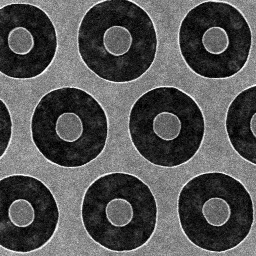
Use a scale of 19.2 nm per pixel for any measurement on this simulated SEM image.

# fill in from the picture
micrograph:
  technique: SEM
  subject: ring-shaped grooves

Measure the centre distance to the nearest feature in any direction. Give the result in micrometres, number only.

1.87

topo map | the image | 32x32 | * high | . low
**.*********.....********....***
......*****.......******......**
......****.........****........*
.......***....*....***....**...*
.***...***...***....**...***...*
.***...***...***....**...***...*
..**...***....**...****...**...*
......****.........****........*
......*****........*****......**
*...********......*******....***
********************************
******.....*******.....*******..
*****.......*****.......*****...
.***.........****........****...
.***....**...***....**...***....
.***...***...***...****...**...*
.***...***...***...***....**....
.***....*....***.........****...
.****........****........****...
*****.......******......******..
*******....********....*********
********************************
.....*******.....*******......**
......*****........****........*
.......****........***.........*
..**...***....**...***....**....
.***...***...***....**...****...
.***...***....**....**....**....
.......****........****........*
.......****........****........*
......******......******......**
**..****************************